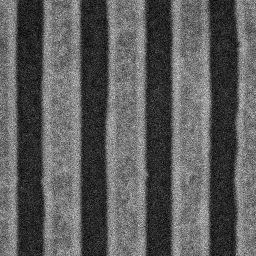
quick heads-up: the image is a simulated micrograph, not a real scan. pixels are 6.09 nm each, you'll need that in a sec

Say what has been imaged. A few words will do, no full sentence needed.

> one or a few lines or trenches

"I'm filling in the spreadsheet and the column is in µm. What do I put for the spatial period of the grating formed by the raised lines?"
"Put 0.393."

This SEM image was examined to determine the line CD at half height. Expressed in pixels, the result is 29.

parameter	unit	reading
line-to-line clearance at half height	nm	212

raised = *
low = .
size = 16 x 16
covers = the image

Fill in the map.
*..**..**..**..*
*..**..**..**..*
*..**..**..**..*
*..**..**..**..*
*..**..**..**..*
*..**..**..**..*
*..**..**..**..*
*..**..**..**..*
*..**..**..**..*
*..**..**..**..*
*..**..**..**..*
*..**..**..**..*
*..**..**..**..*
*..**..**..**..*
*..**..**..**..*
*..**..**..**..*